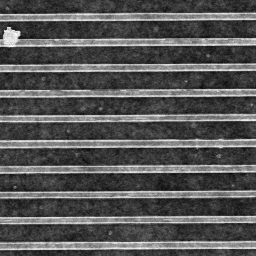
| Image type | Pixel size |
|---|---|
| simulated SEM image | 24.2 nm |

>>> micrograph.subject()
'parallel lines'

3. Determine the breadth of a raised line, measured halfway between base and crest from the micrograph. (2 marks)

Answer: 136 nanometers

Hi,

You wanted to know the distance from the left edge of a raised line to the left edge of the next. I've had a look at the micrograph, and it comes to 0.614 µm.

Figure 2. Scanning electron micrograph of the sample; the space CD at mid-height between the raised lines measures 477 nm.